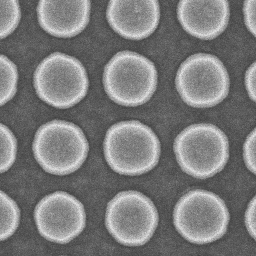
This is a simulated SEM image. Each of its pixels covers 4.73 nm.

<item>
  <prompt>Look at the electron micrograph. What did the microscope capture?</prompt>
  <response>a regular array of raised bodies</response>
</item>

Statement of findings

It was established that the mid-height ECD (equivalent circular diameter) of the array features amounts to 242 nm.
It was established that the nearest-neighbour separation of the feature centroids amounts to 327 nm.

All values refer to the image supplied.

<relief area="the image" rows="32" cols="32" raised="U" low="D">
UUDDDUUUUUUDDDUUUUUUDDDUUUUUDDDU
UUDDDUUUUUUDDDUUUUUUDDUUUUUUDDDU
UUDDDUUUUUUDDDUUUUUUDDUUUUUUDDDU
UUDDDUUUUUDDDDUUUUUDDDDUUUUUDDDU
DDDDDDDDDDDDDDDDUUDDDDDDDUUDDDDD
DDDDDDDDDDDDDDDDDDDDDDDDDDDDDDDD
DDDDDDDDDDDDDDDDDDDDDDDDDDDDDDDD
UDDDDDUUUDDDDDUUUUDDDDDDUUUDDDDD
UUDDDUUUUUDDDUUUUUUDDDDUUUUUDDDU
UUDDUUUUUUUDDUUUUUUDDDUUUUUUDDDU
UUDDDUUUUUUDDUUUUUUDDDUUUUUUDDDU
UUDDDUUUUUUDDDUUUUUDDDDUUUUUDDDU
UDDDDDUUUUDDDDUUUUDDDDDUUUUDDDDD
DDDDDDDDDDDDDDDDDDDDDDDDDDDDDDDD
DDDDDDDDDDDDDDDDDDDDDDDDDDDDDDDD
DDDDDDUUDDDDDDDUUDDDDDDDDDDDDDDD
UDDDDUUUUUDDDDUUUUUDDDDUUUUDDDDD
UUDDDUUUUUUDDUUUUUUUDDUUUUUUDDDU
UUDDUUUUUUUDDUUUUUUUDDUUUUUUDDDU
UUDDDUUUUUUDDUUUUUUUDDUUUUUUDDDU
UDDDDUUUUUDDDDUUUUUDDDDUUUUUDDDU
DDDDDDDUDDDDDDDUUUDDDDDDUUUDDDDD
DDDDDDDDDDDDDDDDDDDDDDDDDDDDDDDD
DDDDDDDDDDDDDDDDDDDDDDDDDDDDDDDD
UDDDDDUUDDDDDDDUUUDDDDDUUUUDDDDD
UUDDDUUUUUDDDDUUUUUDDDUUUUUUDDDU
UUDDUUUUUUDDDDUUUUUDDDUUUUUUDDDU
UUDDUUUUUUDDDUUUUUUDDDUUUUUUDDDU
UUDDDUUUUUDDDDUUUUUDDDUUUUUUDDDU
UDDDDDUUUDDDDDUUUUUDDDDUUUUDDDDD
DDDDDDDDDDDDDDDDDDDDDDDDDDDDDDDD
DDDDDDDDDDDDDDDDDDDDDDDDDDDDDDDD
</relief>